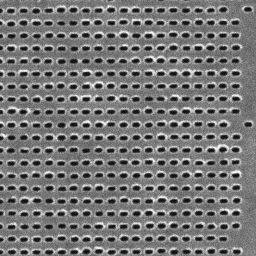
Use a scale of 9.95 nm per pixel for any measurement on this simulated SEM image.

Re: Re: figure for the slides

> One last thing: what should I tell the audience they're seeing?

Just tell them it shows a regular array of holes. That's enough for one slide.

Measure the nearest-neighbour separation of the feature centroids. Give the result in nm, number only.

120